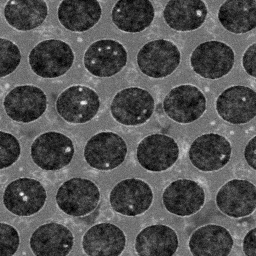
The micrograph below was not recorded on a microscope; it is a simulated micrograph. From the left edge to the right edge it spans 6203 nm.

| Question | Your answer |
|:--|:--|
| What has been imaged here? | a regular array of holes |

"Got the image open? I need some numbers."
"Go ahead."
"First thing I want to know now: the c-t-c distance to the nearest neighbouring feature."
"1260 nm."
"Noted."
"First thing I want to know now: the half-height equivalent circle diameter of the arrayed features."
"0.997 microns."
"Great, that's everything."